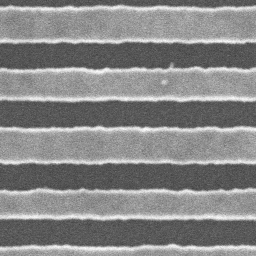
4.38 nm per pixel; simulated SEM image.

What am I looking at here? lines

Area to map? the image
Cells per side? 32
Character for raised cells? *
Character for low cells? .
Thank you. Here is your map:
................................
********************************
********************************
********************************
********************************
................................
................................
................................
........................*..*....
********************************
********************************
********************************
.*************.*****************
................................
................................
................................
********************************
********************************
********************************
********************************
................................
................................
................................
................................
********************************
********************************
********************************
...............................*
................................
................................
................................
********************************